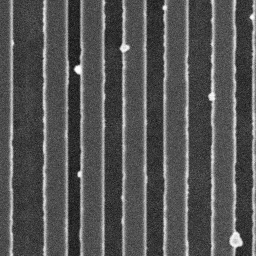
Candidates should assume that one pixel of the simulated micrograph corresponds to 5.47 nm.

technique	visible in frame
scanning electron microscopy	lines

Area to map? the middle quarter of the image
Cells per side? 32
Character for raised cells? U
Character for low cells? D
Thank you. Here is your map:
UDDDUUUUUUDDDDDUUUUUDDDDDUUUUUUD
UDDUUUUUUUDDDDDUUUUUDDDDDUUUUUUD
UDDDUUUUUUDDDDDUUUUUDDDDDUUUUUUD
UDDDUUUUUUDDDDDUUUUUDDDDDUUUUUUD
UDDDUUUUUUDDDDDUUUUUDDDDDUUUUUUD
UDDDUUUUUUDDDDDUUUUUDDDDDUUUUUUD
UDDDUUUUUUDDDDDUUUUUDDDDDUUUUUUD
UDDDUUUUUUDDDDDUUUUUDDDDDUUUUUUD
UDDDUUUUUUDDDDDUUUUUDDDDDUUUUUUD
UDDDUUUUUUDDDDDUUUUUDDDDDUUUUUUD
UDDDUUUUUUDDDDDUUUUUDDDDDUUUUUUD
UDDDUUUUUUDDDDDUUUUUDDDDDUUUUUUD
UDDDUUUUUUDDDDDUUUUUDDDDDUUUUUUD
UDDDUUUUUUDDDDDUUUUUDDDDDUUUUUUD
UDDDUUUUUUDDDDDUUUUUUDDDDUUUUUUD
UDDDUUUUUUDDDDDUUUUUDDDDDUUUUUUD
UDDDUUUUUUDDDDDUUUUUDDDDDUUUUUUD
UDDDUUUUUUDDDDDUUUUUDDDDDUUUUUUD
UDDDUUUUUUDDDDDUUUUUDDDDDUUUUUUD
UDDDUUUUUUDDDDDUUUUUDDDDDUUUUUUD
UDDDUUUUUUDDDDDUUUUUDDDDDUUUUUUD
UDDDUUUUUUDDDDDUUUUUDDDDDUUUUUUD
UDDDUUUUUUDDDDDUUUUUDDDDDUUUUUUD
UDDDUUUUUUDDDDDUUUUUDDDDDUUUUUUD
UDDDUUUUUUDDDDDUUUUUDDDDDUUUUUUD
UDDDUUUUUUDDDDDUUUUUDDDDDUUUUUUD
UDDDUUUUUUDDDDDUUUUUDDDDDUUUUUUD
UDDDUUUUUUDDDDDUUUUUDDDDDUUUUUUD
UDDDUUUUUUDDDDDUUUUUUDDDDUUUUUUD
UDDDUUUUUUDDDDDUUUUUUDDDDUUUUUUD
UDDDUUUUUUDDDDDUUUUUDDDDDUUUUUUD
UDDDUUUUUUDDDDDUUUUUDDDDDUUUUUUD